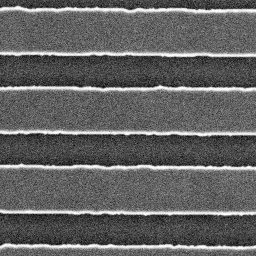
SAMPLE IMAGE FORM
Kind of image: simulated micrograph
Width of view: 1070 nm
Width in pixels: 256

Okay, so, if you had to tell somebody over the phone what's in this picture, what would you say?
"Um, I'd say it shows lines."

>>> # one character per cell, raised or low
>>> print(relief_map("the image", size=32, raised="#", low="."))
................................
################################
################################
################################
################################
################################
################################
................................
................................
................................
................................
################################
################################
################################
################################
################################
################################
................................
................................
................................
................................
################################
################################
################################
################################
################################
################################
................................
................................
................................
................................
################################